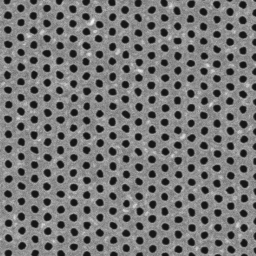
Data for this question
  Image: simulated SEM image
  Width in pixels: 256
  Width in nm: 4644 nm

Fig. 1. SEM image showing a regular array of holes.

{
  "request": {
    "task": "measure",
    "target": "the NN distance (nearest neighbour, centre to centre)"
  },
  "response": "261 nm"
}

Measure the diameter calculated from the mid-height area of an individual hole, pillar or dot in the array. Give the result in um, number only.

0.143